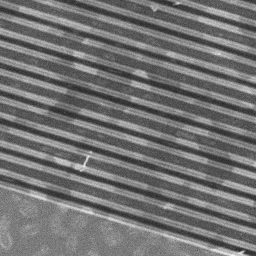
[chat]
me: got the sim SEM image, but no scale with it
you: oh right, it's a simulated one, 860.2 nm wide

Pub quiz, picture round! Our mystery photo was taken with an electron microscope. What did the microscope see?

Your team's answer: parallel lines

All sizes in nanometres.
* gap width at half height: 22.9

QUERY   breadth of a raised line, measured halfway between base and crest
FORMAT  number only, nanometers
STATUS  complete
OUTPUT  16.9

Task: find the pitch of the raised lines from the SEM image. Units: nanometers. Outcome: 44.8